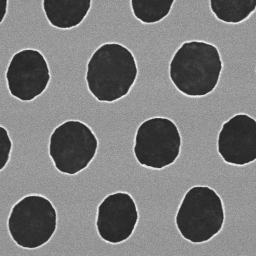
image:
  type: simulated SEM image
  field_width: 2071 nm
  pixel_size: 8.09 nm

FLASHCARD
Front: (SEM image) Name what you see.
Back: a regular array of holes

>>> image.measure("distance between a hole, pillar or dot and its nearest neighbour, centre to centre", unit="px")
83.5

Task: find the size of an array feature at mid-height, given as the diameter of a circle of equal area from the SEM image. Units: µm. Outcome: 0.4